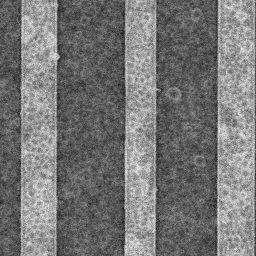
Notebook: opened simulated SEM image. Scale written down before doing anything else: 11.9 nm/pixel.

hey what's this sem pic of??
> one or a few lines or trenches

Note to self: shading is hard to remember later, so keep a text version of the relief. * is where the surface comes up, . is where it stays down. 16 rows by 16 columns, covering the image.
.***....**....**
.**.....**....**
.**.....**....**
.***....**....**
.**.....**....**
.**.....**....**
.**.....**....**
.**.....**....**
.**.....**....**
.**.....**....**
.**.....**....**
.**.....**....**
.***....**....**
.**.....**....**
.**.....**....**
.**.....**....**